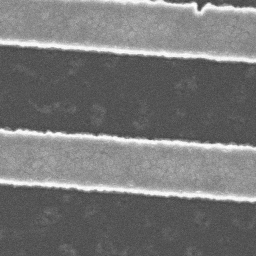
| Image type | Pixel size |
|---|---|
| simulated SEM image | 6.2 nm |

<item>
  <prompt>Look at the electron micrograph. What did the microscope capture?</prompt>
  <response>one or a few lines or trenches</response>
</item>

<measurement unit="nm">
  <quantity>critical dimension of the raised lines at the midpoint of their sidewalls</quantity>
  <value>317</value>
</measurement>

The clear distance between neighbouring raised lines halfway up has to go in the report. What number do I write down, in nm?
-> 539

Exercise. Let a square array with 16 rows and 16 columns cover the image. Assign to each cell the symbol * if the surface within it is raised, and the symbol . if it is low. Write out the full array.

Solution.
***************.
****************
****************
............****
................
................
................
................
******..........
****************
****************
.***************
...............*
................
................
................